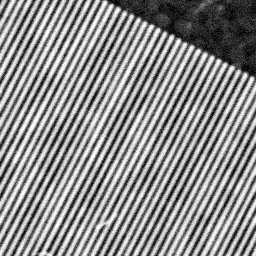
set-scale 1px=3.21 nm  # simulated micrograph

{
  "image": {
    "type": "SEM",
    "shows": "parallel lines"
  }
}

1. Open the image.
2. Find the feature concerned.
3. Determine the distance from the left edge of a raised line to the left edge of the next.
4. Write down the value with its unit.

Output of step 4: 24.1 nanometers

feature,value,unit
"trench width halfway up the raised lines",0.0111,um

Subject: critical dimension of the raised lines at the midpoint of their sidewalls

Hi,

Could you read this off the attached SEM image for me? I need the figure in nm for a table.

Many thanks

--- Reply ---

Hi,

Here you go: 13.5